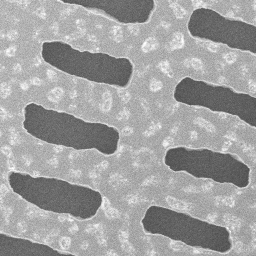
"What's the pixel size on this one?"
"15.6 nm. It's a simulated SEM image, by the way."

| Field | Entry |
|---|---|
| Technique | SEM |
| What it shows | holes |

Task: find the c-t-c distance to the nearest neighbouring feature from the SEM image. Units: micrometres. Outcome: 1.05